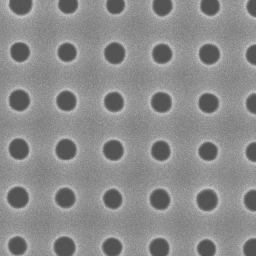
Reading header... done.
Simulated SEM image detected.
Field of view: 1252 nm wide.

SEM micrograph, a regular array of holes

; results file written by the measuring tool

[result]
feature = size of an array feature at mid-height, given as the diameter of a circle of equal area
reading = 0.0945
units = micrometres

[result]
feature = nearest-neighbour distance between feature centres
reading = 47.2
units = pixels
